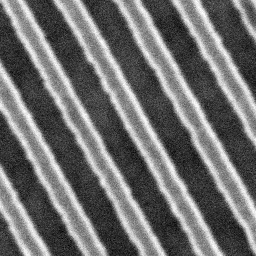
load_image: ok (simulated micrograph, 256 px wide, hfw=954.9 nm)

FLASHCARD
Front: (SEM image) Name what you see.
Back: lines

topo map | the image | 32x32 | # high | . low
###....###.....###....###....###
.###....###....###.....##.....##
..##....###.....###....###....##
..###....###....###.....###....#
..###.....##.....###....###.....
...###....###....###.....###....
....##.....###....###....###....
....###....###.....###....###...
.....##.....###....###.....##...
#....###....###.....###....###..
#.....###....###....###.....###.
##....###.....##.....###....###.
###....###....###.....##.....###
###.....##.....##.....###....###
.###....###....###....###.....##
.###.....##.....##.....###.....#
..###....###....###.....###....#
...##.....###....###....###.....
...###....###....###.....###....
....##.....###....###....###....
....###....###.....##.....###...
.....##.....###....###....###...
#....###.....##.....##.....###..
#.....###....###....###....####.
##....###.....##.....##.....###.
##.....###....###....###.....###
###....###.....###....###....###
.###....###....###.....##.....##
.###.....##.....###....###.....#
..###....###....###.....##.....#
..###.....##.....###....###....#
...###....###.....##.....##.....